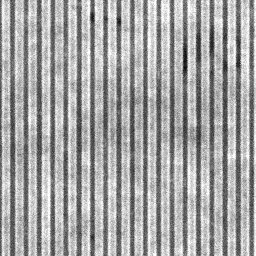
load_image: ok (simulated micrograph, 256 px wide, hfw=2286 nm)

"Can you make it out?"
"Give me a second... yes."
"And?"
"parallel lines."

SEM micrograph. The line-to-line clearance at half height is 53.6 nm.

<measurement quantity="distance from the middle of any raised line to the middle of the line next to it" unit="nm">119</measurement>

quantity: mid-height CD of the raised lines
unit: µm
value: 0.0692